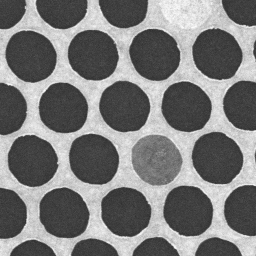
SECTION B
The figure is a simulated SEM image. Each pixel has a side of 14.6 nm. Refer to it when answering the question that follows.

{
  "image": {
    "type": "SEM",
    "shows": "a regular array of holes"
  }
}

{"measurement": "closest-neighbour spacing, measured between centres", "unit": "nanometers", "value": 880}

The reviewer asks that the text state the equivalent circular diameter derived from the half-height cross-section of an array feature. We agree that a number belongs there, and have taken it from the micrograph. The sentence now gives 0.749 um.